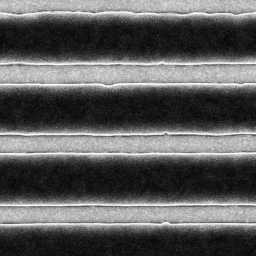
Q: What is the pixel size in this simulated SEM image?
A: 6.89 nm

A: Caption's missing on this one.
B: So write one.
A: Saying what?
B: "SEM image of one or a few lines or trenches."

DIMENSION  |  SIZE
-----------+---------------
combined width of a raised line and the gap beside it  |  484 nm